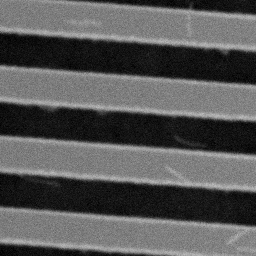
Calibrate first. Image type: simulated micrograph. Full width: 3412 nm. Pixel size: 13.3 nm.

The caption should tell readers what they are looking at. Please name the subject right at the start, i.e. lines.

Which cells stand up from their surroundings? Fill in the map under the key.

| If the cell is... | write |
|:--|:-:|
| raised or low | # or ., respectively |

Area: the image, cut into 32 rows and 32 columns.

##############..................
##########################......
################################
################################
.......#########################
....................############
................................
................................
####............................
################................
#############################...
################################
################################
...........#####################
.......................#########
................................
................................
#######.........................
###################.............
################################
################################
################################
.............###################
.........................#######
................................
................................
########........................
####################............
################################
################################
...#############################
...............#################